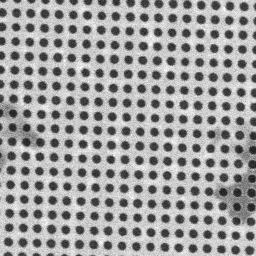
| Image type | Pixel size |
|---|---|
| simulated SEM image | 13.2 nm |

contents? a regular array of holes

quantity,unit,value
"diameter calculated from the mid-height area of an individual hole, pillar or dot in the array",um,0.118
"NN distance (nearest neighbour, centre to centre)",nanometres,185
